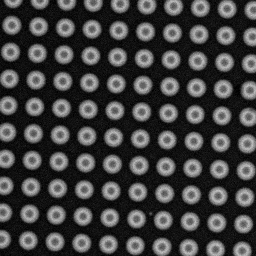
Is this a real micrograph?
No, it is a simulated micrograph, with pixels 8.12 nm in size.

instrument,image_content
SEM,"an array of small figures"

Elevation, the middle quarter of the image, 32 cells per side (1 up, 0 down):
00000000000001000001110001110001
00000000000000000000000000000000
10000010000000000000000000000000
11001111000111100011100000100000
11001111100111100011110011110001
11001111100111100011110011111001
00000111000111100011110011111001
00000000000000000000000001110001
00000000000000000000000000000000
10000110000010000000000000000000
11001111000111100011100001100000
11001111000111100111110011110001
10001111000111100111110011110001
00000110000111000011100011110001
00000000000000000000000000100001
00000000000000000000000000000000
10001110000111000011000000000000
10001111001111100111100011100001
10001111001111100111100011110011
10001111001111000111100011110011
00000000000010000011100011100001
00000000000000000000000000000000
00000100000000000000000000000000
10001110001111000111000001000000
10011111001111000111100011100011
10011111001111000111100111110011
00001110001111000111100111110011
00000000000000000011000011100011
00000000000000000000000000000000
00001100000100000000000000000000
10011110001111000111000011000001
10011110001111001111100111100011